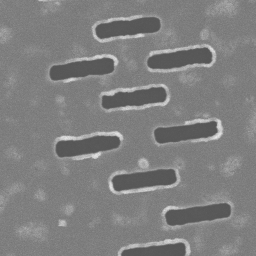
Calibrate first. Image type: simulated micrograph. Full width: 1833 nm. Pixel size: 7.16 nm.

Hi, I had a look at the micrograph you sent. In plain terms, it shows a regular array of holes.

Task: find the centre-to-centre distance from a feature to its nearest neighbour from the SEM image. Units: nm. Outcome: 438